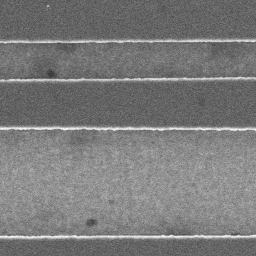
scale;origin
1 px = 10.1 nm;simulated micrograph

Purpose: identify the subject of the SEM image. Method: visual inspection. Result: lines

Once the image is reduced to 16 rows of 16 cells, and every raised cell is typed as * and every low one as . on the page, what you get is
****************
****************
****************
................
................
****************
****************
****************
................
................
................
................
................
................
................
****************